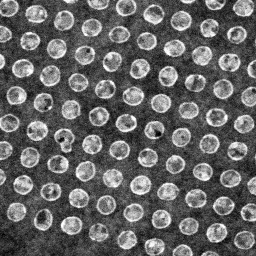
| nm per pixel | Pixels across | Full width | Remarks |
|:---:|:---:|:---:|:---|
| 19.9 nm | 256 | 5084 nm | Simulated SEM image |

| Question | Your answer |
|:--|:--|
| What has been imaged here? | a regular array of raised bodies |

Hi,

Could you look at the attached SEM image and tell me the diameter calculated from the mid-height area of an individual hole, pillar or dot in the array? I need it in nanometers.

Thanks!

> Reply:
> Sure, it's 354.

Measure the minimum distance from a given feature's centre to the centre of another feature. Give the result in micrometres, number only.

0.551